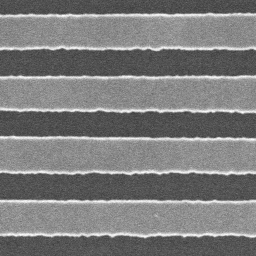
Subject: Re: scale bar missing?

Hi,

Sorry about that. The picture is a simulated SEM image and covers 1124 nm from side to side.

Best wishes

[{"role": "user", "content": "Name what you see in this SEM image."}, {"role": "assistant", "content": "lines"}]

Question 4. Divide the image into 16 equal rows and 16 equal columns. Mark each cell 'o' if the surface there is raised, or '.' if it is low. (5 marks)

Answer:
................
oooooooooooooooo
oooooooooooooooo
................
................
oooooooooooooooo
oooooooooooooooo
................
................
oooooooooooooooo
oooooooooooooooo
................
................
oooooooooooooooo
oooooooooooooooo
................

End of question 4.